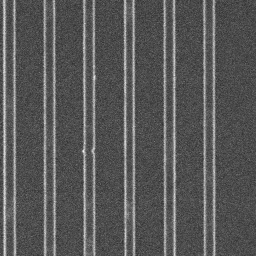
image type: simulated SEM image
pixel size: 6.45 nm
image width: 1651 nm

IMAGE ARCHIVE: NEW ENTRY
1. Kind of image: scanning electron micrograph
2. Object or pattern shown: parallel lines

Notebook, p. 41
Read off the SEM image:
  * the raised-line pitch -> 258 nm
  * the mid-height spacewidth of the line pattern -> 190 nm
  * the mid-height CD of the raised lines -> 67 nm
